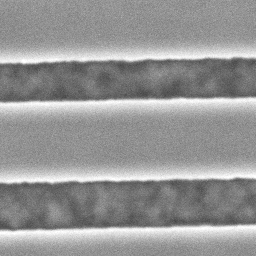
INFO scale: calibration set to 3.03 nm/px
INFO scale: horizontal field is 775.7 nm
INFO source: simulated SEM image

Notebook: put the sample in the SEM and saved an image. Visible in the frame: lines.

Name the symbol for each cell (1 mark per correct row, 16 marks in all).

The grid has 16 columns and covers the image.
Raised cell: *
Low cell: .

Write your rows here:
****************
****************
****************
****************
................
................
****************
****************
****************
****************
****************
................
................
................
****************
****************